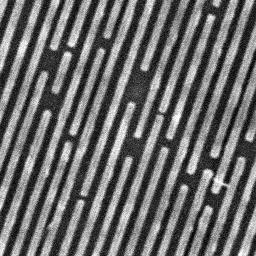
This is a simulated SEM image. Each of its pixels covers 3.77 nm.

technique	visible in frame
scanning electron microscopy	parallel lines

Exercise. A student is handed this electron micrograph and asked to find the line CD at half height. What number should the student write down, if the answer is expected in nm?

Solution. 27.1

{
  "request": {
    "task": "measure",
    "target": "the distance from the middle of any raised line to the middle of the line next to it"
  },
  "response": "58 nm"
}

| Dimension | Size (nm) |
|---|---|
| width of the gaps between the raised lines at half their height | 32.1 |